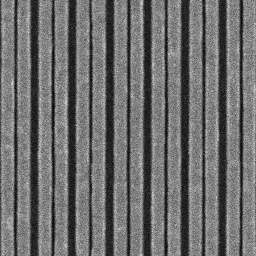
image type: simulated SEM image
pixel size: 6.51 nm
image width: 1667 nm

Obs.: parallel lines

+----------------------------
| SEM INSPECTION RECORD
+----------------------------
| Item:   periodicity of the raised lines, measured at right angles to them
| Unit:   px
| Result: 18.7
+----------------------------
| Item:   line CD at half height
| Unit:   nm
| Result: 83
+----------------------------